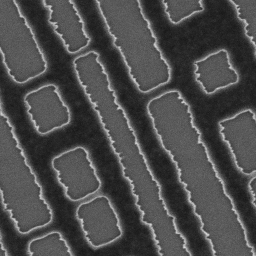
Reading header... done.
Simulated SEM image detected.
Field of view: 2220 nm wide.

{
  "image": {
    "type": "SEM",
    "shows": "parallel lines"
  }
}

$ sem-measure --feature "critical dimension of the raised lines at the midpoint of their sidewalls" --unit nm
224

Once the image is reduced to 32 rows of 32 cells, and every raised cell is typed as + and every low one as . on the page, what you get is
..++++...+++.....++++....++++...
..++++....+++.....+++...++++++..
...+++....+++.....+++..+++++++..
....+++...++++.....++++++++++++.
....++++...+++.....++++++++++++.
.....+++...++++....+++++++++++++
.....++++++++++.....+++++++.++++
+....+++++..++++....+++++...++++
+.....++++...+++.....++++....+++
++..++++++...++++....++++.....++
++++++++++....+++...+++++....+++
++++...++++...++++++++++++++++++
+++.....+++...+++++....+++++++++
++++....++++...++++....+++++++++
++++.....++++...+++.....++++++..
.+++....+++++...+++.....++++....
..+++.++++++++...+++.....+++....
..++++++++++++...+++.....+++....
..++++++++++++...++++.....+++...
...+++++...++++...+++.....+++...
...++++....++++...++++....++++..
....+++.....++++...+++.....++++.
....++++....++++...++++....+++++
.....+++....+++++...+++.....+++.
.....++++..++++++...++++....++++
+.....+++++...+++...++++.....+++
+.....++++....++++...++++....+++
++....++++.....+++....+++.....++
++..++++++.....++++...+++.....++
++++++.++++....++++....+++.....+
++++....++++.+++++++...++++....+
.+++.....+..++++++++...++++.....